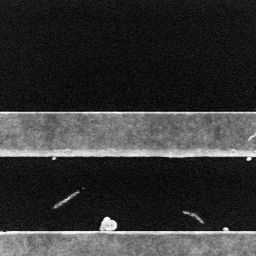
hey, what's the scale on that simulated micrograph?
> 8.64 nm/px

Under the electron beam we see lines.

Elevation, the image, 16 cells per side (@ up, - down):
----------------
----------------
----------------
----------------
----------------
----------------
----------------
@@@@@@@@@@@@@@@@
@@@@@@@@@@@@@@@@
@@@@@@@@@@@@@@@@
----------------
----------------
----------------
----------------
--@@@@@@@-@@@@@@
@@@@@@@@@@@@@@@@